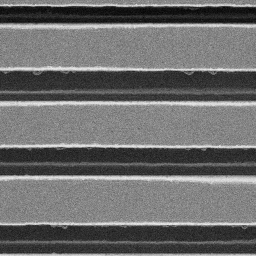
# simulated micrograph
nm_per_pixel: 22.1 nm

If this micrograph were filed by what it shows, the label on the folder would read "lines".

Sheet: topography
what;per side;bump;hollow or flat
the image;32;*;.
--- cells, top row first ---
********************************
................................
................................
********************************
********************************
********************************
********************************
********************************
********************************
................................
................................
................................
................................
********************************
********************************
********************************
********************************
********************************
................................
................................
................................
................................
********************************
********************************
********************************
********************************
********************************
********************************
................................
................................
................................
................................